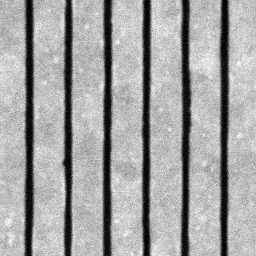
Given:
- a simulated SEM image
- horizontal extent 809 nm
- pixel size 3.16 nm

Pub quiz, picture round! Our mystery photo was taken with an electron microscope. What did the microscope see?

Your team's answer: parallel lines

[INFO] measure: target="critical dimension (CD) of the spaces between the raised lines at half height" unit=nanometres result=28.1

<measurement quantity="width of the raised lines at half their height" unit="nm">96.9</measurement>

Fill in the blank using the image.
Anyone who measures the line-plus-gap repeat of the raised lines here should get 123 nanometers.